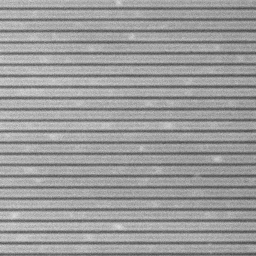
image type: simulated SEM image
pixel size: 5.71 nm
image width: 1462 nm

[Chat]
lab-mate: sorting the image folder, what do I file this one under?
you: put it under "parallel lines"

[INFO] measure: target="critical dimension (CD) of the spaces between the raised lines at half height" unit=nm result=19.3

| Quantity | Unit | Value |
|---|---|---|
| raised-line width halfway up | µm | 0.0442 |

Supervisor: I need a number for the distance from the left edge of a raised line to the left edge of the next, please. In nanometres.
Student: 63.7